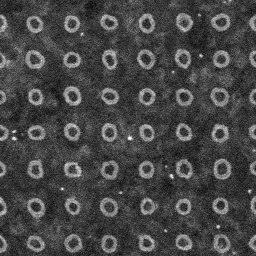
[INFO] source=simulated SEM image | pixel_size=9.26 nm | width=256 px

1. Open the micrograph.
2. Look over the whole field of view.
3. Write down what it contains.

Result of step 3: a regular array of ring-shaped raised bodies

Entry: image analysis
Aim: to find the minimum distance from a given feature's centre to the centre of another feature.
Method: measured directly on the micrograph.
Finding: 335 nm